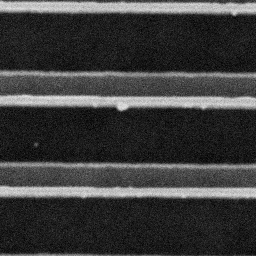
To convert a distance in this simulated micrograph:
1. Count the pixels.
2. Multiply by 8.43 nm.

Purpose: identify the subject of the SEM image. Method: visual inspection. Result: lines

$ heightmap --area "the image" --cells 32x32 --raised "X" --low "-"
XXXXXXXXXXXXXXXXXXXXXXXXXXXXXXXX
-----------------------------X--
--------------------------------
--------------------------------
--------------------------------
--------------------------------
--------------------------------
--------------------------------
--------------------------------
XXXXXXXXXXXXXXXXXXXXXXXXXXXXXX-X
XXXXXXXXXXXXXXXXXXXXXXXXXXXXXXXX
XXXXXXXXXXXXXXXXXXXXXXXXXXXXXXXX
XXXXXXXXXXXXXXXXXXXXXXXXXXXXXXXX
---------------X---------X------
--------------------------------
--------------------------------
--------------------------------
--------------------------------
--------------------------------
--------------------------------
--------------------------------
XXXXXXXXXXXXXXXXXXXXXXXXXXXXXXXX
XXXXXXXXXXXXXXXXXXXXXXXXXXXXXXXX
XXXXXXXXXXXXXXXXXXXXXXXXXXXXXXXX
----------X-----------XXX-----XX
--------------------------------
--------------------------------
--------------------------------
--------------------------------
--------------------------------
--------------------------------
--------------------------------